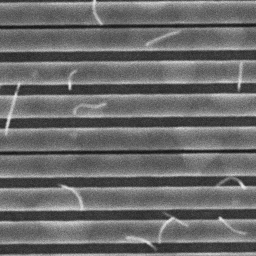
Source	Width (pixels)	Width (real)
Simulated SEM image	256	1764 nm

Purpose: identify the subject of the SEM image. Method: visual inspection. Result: wiring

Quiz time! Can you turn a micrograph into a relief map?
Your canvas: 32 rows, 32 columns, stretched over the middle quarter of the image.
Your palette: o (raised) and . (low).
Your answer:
oooooooooooooooooooooooooooooooo
oooooooooooooooooooooooooooooooo
oooooooooooooooooooooooooooooooo
oooooooooooooooooooooooooooooooo
oooooooooooooooooooooooooooooooo
................................
................................
................................
oooooooooooooooooooooooooooooooo
oooooooooooooooooooooooooooooooo
oooooooooooooooooooooooooooooooo
oooooooooooooooooooooooooooooooo
oooooooooooooooooooooooooooooooo
................................
................................
................................
oooooooooooooooooooooooooooooooo
oooooooooooooooooooooooooooooooo
oooooooooooooooooooooooooooooooo
oooooooooooooooooooooooooooooooo
oooooooooooooooooooooooooooooooo
................................
................................
oooooooooooooooooooooooooooooooo
oooooooooooooooooooooooooooooooo
oooooooooooooooooooooooooooooooo
oooooooooooooooooooooooooooooooo
oooooooooooooooooooooooooooooooo
................................
................................
................................
oooooooooooooooooooooooooooooooo